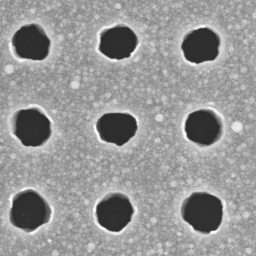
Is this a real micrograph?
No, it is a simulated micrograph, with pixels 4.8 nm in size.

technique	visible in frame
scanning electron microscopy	a regular array of holes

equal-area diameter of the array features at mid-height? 173 nm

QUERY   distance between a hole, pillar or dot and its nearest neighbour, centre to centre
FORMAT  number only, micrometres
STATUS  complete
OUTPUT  0.403